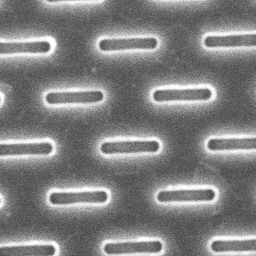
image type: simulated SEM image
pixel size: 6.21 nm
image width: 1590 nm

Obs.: holes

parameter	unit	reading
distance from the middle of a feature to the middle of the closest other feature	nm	459